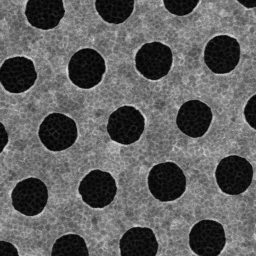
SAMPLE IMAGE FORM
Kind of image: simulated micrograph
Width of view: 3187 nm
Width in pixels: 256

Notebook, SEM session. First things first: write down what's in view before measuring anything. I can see a regular array of holes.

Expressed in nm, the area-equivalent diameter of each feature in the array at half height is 482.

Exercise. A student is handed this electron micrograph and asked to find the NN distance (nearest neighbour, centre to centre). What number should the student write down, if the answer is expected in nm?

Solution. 848